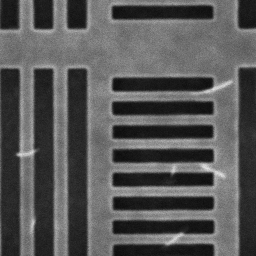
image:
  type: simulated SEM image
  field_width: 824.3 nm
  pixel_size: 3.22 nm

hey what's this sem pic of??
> groups of lines, slits or small figures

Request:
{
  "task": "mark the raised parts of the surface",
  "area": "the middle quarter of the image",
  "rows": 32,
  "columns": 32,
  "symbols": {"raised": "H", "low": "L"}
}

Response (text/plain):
HHHHHHHHHHHHHHHHHHHHHHHHHHHHHHHH
HLLLLLHHHHHHHHHHHHHHHHHHHHHHHHHH
HLLLLLHHHHHHHHHHHHHHHHHHHHHHHHHH
HLLLLLHHHHHHLLLLLLLLLLLLLLLLLLLL
HLLLLLHHHHHHLLLLLLLLLLLLLLLLLLLL
HLLLLLHHHHHHLLLLLLLLLLLLLLLLLLLL
HLLLLLHHHHHHLLLLLLLLLLLLLLLLLLLL
HLLLLLHHHHHHHHHHHHHHHHHHHHHHHHHH
HLLLLLHHHHHHHHHHHHHHHHHHHHHHHHHH
HLLLLLHHHHHHLLLLLLLLLLLLLLLLLLLL
HLLLLLHHHHHHLLLLLLLLLLLLLLLLLLLL
HLLLLLHHHHHHLLLLLLLLLLLLLLLLLLLL
HLLLLLHHHHHHLLLLLLLLLLLLLLLLLLLL
HLLLLLHHHHHHHHHHHHHHHHHHHHHHHHHH
HLLLLLHHHHHHHHHHHHHHHHHHHHHHHHHH
HLLLLLHHHHHHLLLLLLLLLLLLLLLLLLLL
HLLLLLHHHHHHLLLLLLLLLLLLLLLLLLLL
HLLLLLHHHHHHLLLLLLLLLLLLLLLLLLLL
HLLLLLHHHHHHLLLLLLLLLLLLLLLLLLLL
HLLLLLHHHHHHHHHHHHHHHHHHHHHHHHHH
HLLLLLHHHHHHHHHHHHHHHHHHHHHHHHHH
HLLLLLHHHHHHLLLLLLLLLLLLLLLLLLLL
HLLLLLHHHHHHLLLLLLLLLLLLLLLLLLLL
HLLLLLHHHHHHLLLLLLLLLLLLLLLLLLLL
HLLLLLHHHHHHLLLLLLLLLLLLLLLLLLLL
HLLLLLHHHHHHHHHHHHHHHHHHHHHHHHHH
HLLLLLHHHHHHHHHHHHHHHHHHHHHHHHHH
HLLLLLHHHHHHLLLLLLLLLLLLLLLLLLLL
HLLLLLHHHHHHLLLLLLLLLLLLLLLLLLLL
HLLLLLHHHHHHLLLLLLLLLLLLLLLLLLLL
HLLLLLHHHHHHLLLLLLLLLLLLLLLLLLLL
HLLLLLHHHHHHHHHHHHHHHHHHHHHHHHHH